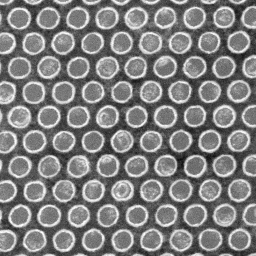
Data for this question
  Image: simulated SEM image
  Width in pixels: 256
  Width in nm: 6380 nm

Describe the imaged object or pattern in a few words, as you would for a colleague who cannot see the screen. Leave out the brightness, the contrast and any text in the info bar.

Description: a regular array of raised bodies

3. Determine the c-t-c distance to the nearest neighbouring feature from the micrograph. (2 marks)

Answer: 706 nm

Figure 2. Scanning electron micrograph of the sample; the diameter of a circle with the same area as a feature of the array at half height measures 0.525 micrometres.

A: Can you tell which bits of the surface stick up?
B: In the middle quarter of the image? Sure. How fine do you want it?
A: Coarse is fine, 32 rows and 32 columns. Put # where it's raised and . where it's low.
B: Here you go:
.#####..#####..#####...#####..##
.#####..#####..#####...#####..##
.#####...###....####...####....#
..........#.....................
.....................##.....##..
##...#####...####...####...####.
##...#####..#####..#####..######
##...#####..#####..#####..#####.
##...####....###....####...####.
#.....##......#.................
................................
..####...####....###...####....#
.#####...####...#####..#####..##
.#####..#####...#####..#####..##
.#####..#####...####...#####...#
..###....##......##.....##......
................................
##...####....###....####...####.
###..#####..#####..#####...#####
###..#####..#####..#####...#####
##...#####..#####...####...####.
#.....##.....##.....###.....##..
................................
...##....####....###....###.....
.#####...####...#####..#####...#
.#####..#####...#####..#####..##
.#####...####...#####..#####..##
..###....####...####....###....#
................................
##....###.....##.....###....###.
##...#####...####...####...#####
###..#####..#####..#####...#####